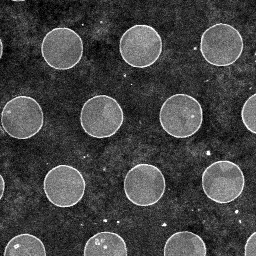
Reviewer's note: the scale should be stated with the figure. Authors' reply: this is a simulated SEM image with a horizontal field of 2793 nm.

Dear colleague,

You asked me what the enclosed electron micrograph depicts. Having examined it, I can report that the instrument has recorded a regular array of raised bodies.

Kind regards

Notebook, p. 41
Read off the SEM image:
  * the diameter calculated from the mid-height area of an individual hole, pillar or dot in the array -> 455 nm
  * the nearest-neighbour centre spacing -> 855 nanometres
